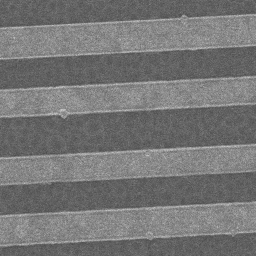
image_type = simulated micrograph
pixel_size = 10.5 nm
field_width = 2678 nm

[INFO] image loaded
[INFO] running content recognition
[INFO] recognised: one or a few lines or trenches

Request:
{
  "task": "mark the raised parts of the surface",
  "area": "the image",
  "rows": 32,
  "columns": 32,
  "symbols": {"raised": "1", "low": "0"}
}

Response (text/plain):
00000000000000000000000000000000
00000000000000000000000000000000
00000000000000000000011111111111
00111111111111111111111111111111
11111111111111111111111111111111
11111111111111111111111111111111
11111111111111100000000000000000
00000000000000000000000000000000
00000000000000000000000000000000
00000000000000000000000000000000
00000000000000000111111111111111
11111111111111111111111111111111
11111111111111111111111111111111
11111111111111111111100000000000
11100000000000000000000000000000
00000000000100000000000000000000
00000000000100000000000000000000
00000000000000000000000000000000
00000000000000000000000001111111
00000011111111111111111111111111
11111111111111111111111111111111
11111111111111111111111111111000
11111111110100000000000000000000
00000000000000000000000000000000
00000000000000000000000000000000
00000000000000000000000000000111
00000000001111111111111111111111
11111111111111111111111111111111
11111111111111111111111111111111
11111111111111111111100000000000
11000000000000000000000000000000
00000000000000000000000000000000